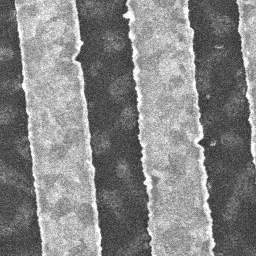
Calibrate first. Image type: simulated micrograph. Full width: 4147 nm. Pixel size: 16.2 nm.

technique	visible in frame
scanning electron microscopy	one or a few lines or trenches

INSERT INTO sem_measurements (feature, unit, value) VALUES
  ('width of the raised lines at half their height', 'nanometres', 954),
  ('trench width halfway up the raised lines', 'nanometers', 836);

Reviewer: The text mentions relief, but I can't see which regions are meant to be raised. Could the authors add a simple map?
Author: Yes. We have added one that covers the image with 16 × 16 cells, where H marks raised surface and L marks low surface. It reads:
LHHHHLLLHHHHLLLH
LHHHHLLLHHHHLLLH
LHHHHLLLHHHHLLLH
LHHHHLLLHHHHLLLH
LHHHHLLLHHHHLLLH
LLHHHLLLLHHHLLLH
LLHHHLLLLHHHLLLL
LLHHHLLLLHHHLLLL
LLHHHHLLLHHHLLLL
LLHHHHLLLHHHHLLL
LLHHHHLLLHHHHLLL
LLHHHHLLLHHHHLLL
LLHHHHLLLHHHHLLL
LLHHHHLLLHHHHLLL
LLLHHHLLLHHHHLLL
LLLHHHLLLHHHHLLL